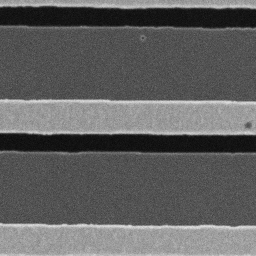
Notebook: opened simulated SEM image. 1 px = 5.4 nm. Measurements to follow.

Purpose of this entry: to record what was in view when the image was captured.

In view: lines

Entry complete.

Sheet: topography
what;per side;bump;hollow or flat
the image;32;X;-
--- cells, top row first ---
XXXXXXXXXXXXXXXXXXXXXXXXXXXXXXXX
--------------------------------
--------------------------------
XXXXXXXXXXXXXXXXXXXXXX----------
XXXXXXXXXXXXXXXXXXXXXXXXXXXXXXXX
XXXXXXXXXXXXXXXXXXXXXXXXXXXXXXXX
XXXXXXXXXXXXXXXXXXXXXXXXXXXXXXXX
XXXXXXXXXXXXXXXXXXXXXXXXXXXXXXXX
XXXXXXXXXXXXXXXXXXXXXXXXXXXXXXXX
XXXXXXXXXXXXXXXXXXXXXXXXXXXXXXXX
XXXXXXXXXXXXXXXXXXXXXXXXXXXXXXXX
XXXXXXXXXXXXXXXXXXXXXXXXXXXXXXXX
XXXXXXXXXXXXXXXXXXXXXXXXXXXXXXXX
XXXXXXXXXXXXXXXXXXXXXXXXXXXXXXXX
XXXXXXXXXXXXXXXXXXXXXXXXXXXXXXXX
XXXXXXXXXXXXXXXXXXXXXXXXXXXXXXXX
XXXXXXXXXXXXXXXXXXXXXXXXXXXXXXXX
--------------------------------
--------------------------------
XXXXXXXXXXXXXXXXXXXXXXXXXXXXXXXX
XXXXXXXXXXXXXXXXXXXXXXXXXXXXXXXX
XXXXXXXXXXXXXXXXXXXXXXXXXXXXXXXX
XXXXXXXXXXXXXXXXXXXXXXXXXXXXXXXX
XXXXXXXXXXXXXXXXXXXXXXXXXXXXXXXX
XXXXXXXXXXXXXXXXXXXXXXXXXXXXXXXX
XXXXXXXXXXXXXXXXXXXXXXXXXXXXXXXX
XXXXXXXXXXXXXXXXXXXXXXXXXXXXXXXX
XXXXXXXXXXXXXXXXXXXXXXXXXXXXXXXX
XXXXXXXXXXXXXXXXXXXXXXXXXXXXXXXX
XXXXXXXXXXXXXXXXXXXXXXXXXXXXXXXX
XXXXXXXXXXXXXXXXXXXXXXXXXXXXXXXX
XXXXXXXXXXXXXXXXXXXXXXXXXXXXXXXX